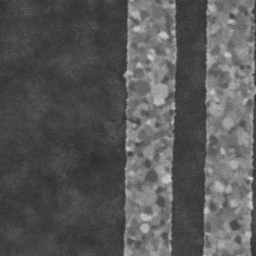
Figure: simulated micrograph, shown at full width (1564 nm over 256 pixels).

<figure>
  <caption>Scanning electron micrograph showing one or a few lines or trenches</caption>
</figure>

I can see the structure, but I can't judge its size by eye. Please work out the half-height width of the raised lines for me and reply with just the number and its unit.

282 nm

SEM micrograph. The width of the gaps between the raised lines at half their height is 204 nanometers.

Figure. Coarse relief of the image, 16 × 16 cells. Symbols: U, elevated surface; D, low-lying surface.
DDDDDDDDUUUDDUUU
DDDDDDDDUUUDDUUU
DDDDDDDDUUUDDUUU
DDDDDDDDUUUDDUUU
DDDDDDDDUUUDDUUU
DDDDDDDDUUUDDUUU
DDDDDDDDUUUDDUUU
DDDDDDDDUUUDDUUU
DDDDDDDDUUUDDUUU
DDDDDDDDUUUDDUUU
DDDDDDDDUUUDDUUU
DDDDDDDDUUUDDUUU
DDDDDDDDUUUDDUUU
DDDDDDDDUUUDDUUU
DDDDDDDDUUUDDUUU
DDDDDDDDUUUDDUUU